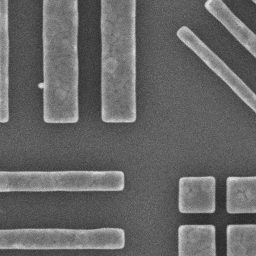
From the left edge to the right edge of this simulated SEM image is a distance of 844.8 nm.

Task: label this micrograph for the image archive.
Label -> groups of lines, slits or small figures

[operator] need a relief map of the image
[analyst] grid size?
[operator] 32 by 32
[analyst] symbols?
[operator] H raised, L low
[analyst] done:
HLLLLHHHHHLLLHHHHLLLLLLLLLHHLLLL
HLLLLHHHHHLLLHHHHLLLLLLLLLHHHLLL
HLLLLHHHHHLLLHHHHLLLLLLLLLLHHHLL
HLLLLHHHHHLLLHHHHLLLLLLLLLLLHHHL
HLLLLHHHHHLLLHHHHLLLLLHHHLLLLHHH
HLLLLHHHHHLLLHHHHLLLLLLHHHLLLLHH
HLLLLHHHHHLLLHHHHLLLLLLLHHHLLLLH
HLLLLHHHHHLLLHHHHLLLLLLLLHHHLLLL
HLLLLHHHHHLLLHHHHLLLLLLLLLHHHLLL
HLLLLHHHHHLLLHHHHLLLLLLLLLLHHHLL
HLLLLLHHHHLLLHHHHLLLLLLLLLLLHHHL
HLLLLHHHHHLLLHHHHLLLLLLLLLLLLHHH
HLLLLHHHHHLLLHHHHLLLLLLLLLLLLLHH
HLLLLLHHHHLLLHHHHLLLLLLLLLLLLLLH
HLLLLHHHHHLLLHHHHLLLLLLLLLLLLLLL
LLLLLLLLLLLLLLLLLLLLLLLLLLLLLLLL
LLLLLLLLLLLLLLLLLLLLLLLLLLLLLLLL
LLLLLLLLLLLLLLLLLLLLLLLLLLLLLLLL
LLLLLLLLLLLLLLLLLLLLLLLLLLLLLLLL
LLLLLLLLLLLLLLLLLLLLLLLLLLLLLLLL
LLLLLLLLLLLLLLLLLLLLLLLLLLLLLLLL
HHHHHHHHHHHHHHHLLLLLLLLLLLLLLLLL
HHHHHHHHHHHHHHHLLLLLLLLHHHHLHHHH
HHHHHHHHHHHHHHHLLLLLLLHHHHHLHHHH
LLLLLLLLLLLLLLLLLLLLLLHHHHHLHHHH
LLLLLLLLLLLLLLLLLLLLLLHHHHHLHHHH
LLLLLLLLLLLLLLLLLLLLLLLHHHLLLHHH
LLLLLLLLLLLLLLLLLLLLLLLLLLLLLLLL
LLLLLLLLLLLLLLLLLLLLLLLHHHHLLHHH
HHHHHHHHHHHHHHHLLLLLLLHHHHHLHHHH
HHHHHHHHHHHHHHHLLLLLLLHHHHHLHHHH
LLLLLLLLLLLLLLLLLLLLLLHHHHHLLHHH